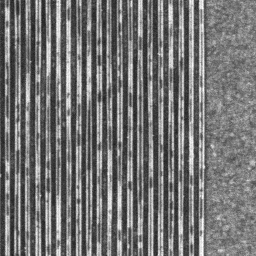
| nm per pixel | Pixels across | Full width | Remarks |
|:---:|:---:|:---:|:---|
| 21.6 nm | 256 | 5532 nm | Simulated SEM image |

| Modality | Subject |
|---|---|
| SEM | parallel lines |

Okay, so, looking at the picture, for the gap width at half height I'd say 148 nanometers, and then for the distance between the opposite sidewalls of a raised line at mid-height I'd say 83.7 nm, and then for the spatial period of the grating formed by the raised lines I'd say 0.221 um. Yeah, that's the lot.